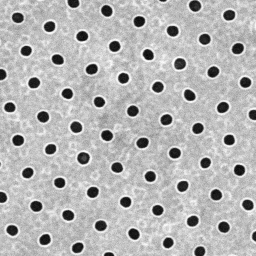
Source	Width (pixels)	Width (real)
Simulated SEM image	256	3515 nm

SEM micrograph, a regular array of holes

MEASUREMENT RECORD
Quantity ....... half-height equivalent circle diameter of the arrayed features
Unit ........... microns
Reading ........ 0.169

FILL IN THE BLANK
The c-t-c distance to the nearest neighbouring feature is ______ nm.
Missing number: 454